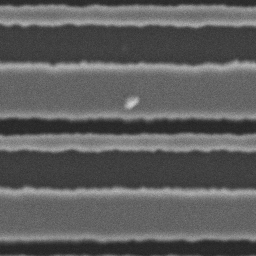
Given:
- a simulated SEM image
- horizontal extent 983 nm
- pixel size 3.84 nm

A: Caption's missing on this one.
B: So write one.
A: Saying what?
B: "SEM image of lines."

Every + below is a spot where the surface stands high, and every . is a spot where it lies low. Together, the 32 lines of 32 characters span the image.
................................
++++++++++++++++++++++++++++++++
++++++++++++++++++++++++++++++++
................................
................................
................................
................................
................................
++++++++++++++++++++++++++++++++
++++++++++++++++++++++++++++++++
++++++++++++++++++++++++++++++++
++++++++++++++++++++++++++++++++
++++++++++++++++++++++++++++++++
++++++++++++++++++++++++++++++++
++++++++++++++++++++++++++++++++
................................
................................
++++++++++++++++++++++++++++++++
++++++++++++++++++++++++++++++++
................................
................................
................................
................................
................................
++++++++++++++++++++++++++++++++
++++++++++++++++++++++++++++++++
++++++++++++++++++++++++++++++++
++++++++++++++++++++++++++++++++
++++++++++++++++++++++++++++++++
++++++++++++++++++++++++++++++++
................................
................................